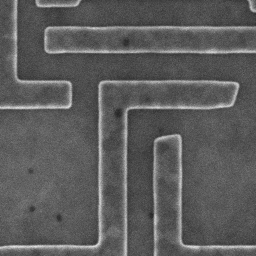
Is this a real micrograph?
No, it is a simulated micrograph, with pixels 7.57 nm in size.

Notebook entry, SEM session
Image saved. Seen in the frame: wiring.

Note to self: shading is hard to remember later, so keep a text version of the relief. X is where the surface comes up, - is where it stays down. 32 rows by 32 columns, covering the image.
XX---XXXXX---------------------X
XX------------------------------
XX------------------------------
XX----XXXXXX-XXXXXXXXXXXXXXXXXXX
XX----XXXXXXXXXXXXXXXXXXXXXXXXXX
XX----XXXXXXXXXXXXXXXXXXXXXXXXXX
XX----XXXXXXXXXXXXXXXXXXXXXXXXXX
XX------------------------------
XX------------------------------
XX------------------------------
XXXXXXXXX----XXXXXXXXXXXXXXXXX--
XXXXXXXXX---XXXXXXXXXXXXXXXXXX--
XXXXXXXXX---XXXXXXXXXXXXXXXXX---
------------XXXXX-------XXX-----
------------XXXX----------------
------------XXXX----------------
------------XXXX----------------
------------XXXX---XXXX---------
------------XXXX---XXXX---------
-------------XXX---XXXX---------
------------XXXX---XXXX---------
------------XXXX---XXXX---------
------------XXXX---XXXX---------
------------XXXX---XXXX---------
------------XXXX---XXXX---------
------------XXXX---XXXX---------
------------XXXX---XXXX---------
------------XXXX---XXXX---------
------------XXXX---XXXX---------
------------XXXX---XXXX---------
------------XXXX---XXXX---------
XXXXXXXXXXXXXXXX---XXXXXXXXXXXXX